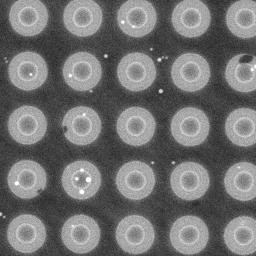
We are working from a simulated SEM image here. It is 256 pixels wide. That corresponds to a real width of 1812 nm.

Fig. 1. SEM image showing an array of small figures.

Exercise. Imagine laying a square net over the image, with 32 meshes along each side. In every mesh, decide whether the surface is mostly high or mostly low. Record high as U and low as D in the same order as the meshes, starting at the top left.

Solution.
UUDDDUUUUDDDUUUUDDDUUUDDDUUUUDDD
UDDDDDUUDDDDDUUDDDDUUUDDDDUUUDDD
UDDDDDUUDDDDDUUDDDDUUUDDDDUUDDDD
UUDDDUUUUDDDUUUDDDDUUUDDDDUUUDDD
UUUUUUUUUUUUUUUUUUUUUUUUDUUUUUDU
UUUUUUUUUUUUUUUUUUUUUUUUUUUUUUUU
UUUUUUUUUUUUUUUUUUUUUUUUUUUUUUUU
UUDDDUUUDDDDUUUDDDDUUUDDDDUUUDDD
UDDDDDUUDDDDDUUDDDDUUUDDDDUUDDDD
UDDDDDUUDDDDDUUDDDDUUUDDDDUUDDDD
UUDDDUUUUDDDUUUDDDDUUUDDDDUUUDDD
UUUUUUUUUUUUUUUUUUUUUUUUUUUUUUUU
UUUUUUUUUUUUUUUUUUUUUUUUUUUUUUUU
UUUDUUUUUUDUUUUUUUUUUUUUUUUUUUUU
UDDDDUUUDDDDUUUDDDDUUUDDDDUUUDDD
UDDDDDUUDDDDUUUDDDDUUDDDDDUUDDDD
UDDDDDUUDDDDUUUDDDDUUUDDDDUUDDDD
UUDDDUUUUDDDUUUDDDDUUUDDDUUUUDDD
UUUUUUUUUUUUUUUUUUUUUUUUUUUUUUUU
UUUUUUUUUUUUUUUUUUUUUUUUUUUUUUUU
UUDDDUUUUDDUUUUUDDUUUUUDDUUUUUDU
UDDDDUUUDDDDUUUDDDDUUUDDDDUUUDDD
UDDDDDUUDDDDDUUDDDDUUDDDDDUUDDDD
UDDDDUUUDDDDUUUDDDDUUUDDDDUUDDDD
UUDDUUUUUDDUUUUUDDUUUUDDDUUUUDDD
UUUUUUUUUUUUUUUUUUUUUUUUUUUUUUUU
UUUUUUUUUUUUUUUUUUUUUUUUUUUUUUUU
UUDDDUUUUDDDUUUDDDUUUUDDDUUUUDDD
UDDDDDUUDDDDUUUDDDDUUUDDDDUUDDDD
UDDDDDUUDDDDUUUDDDDUUDDDDDUUDDDD
UDDDDUUUDDDDUUUDDDDUUUDDDDUUDDDD
UUUUUUUUUUUUUUUUDDUUUUUDDUUUUDDU